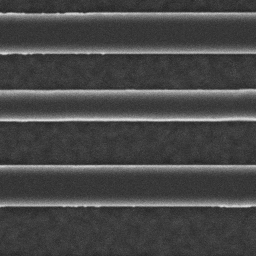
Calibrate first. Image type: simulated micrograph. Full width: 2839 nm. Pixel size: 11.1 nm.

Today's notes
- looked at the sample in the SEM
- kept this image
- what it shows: lines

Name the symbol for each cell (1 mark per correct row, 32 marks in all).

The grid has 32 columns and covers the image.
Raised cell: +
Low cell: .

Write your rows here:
................................
................................
++++++++++++++++++++++++++++++++
++++++++++++++++++++++++++++++++
++++++++++++++++++++++++++++++++
++++++++++++++++++++++++++++++++
++++++++++++++++++++++++++++++++
................................
................................
................................
................................
++++++++++++++++++++++++++++++++
++++++++++++++++++++++++++++++++
++++++++++++++++++++++++++++++++
++++++++++++++++++++++++++++++++
................................
................................
................................
................................
................................
................................
++++++++++++++++++++++++++++++++
++++++++++++++++++++++++++++++++
++++++++++++++++++++++++++++++++
++++++++++++++++++++++++++++++++
++++++++++++++++++++++++++++++++
................................
................................
................................
................................
................................
................................